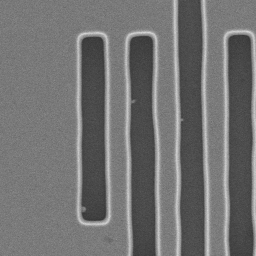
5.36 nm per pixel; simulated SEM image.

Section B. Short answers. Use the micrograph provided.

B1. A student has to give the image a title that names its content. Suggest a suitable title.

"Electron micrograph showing groups of lines, slits or small figures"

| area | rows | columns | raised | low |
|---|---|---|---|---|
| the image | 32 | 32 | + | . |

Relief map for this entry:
++++++++++++++++++++++...+++++++
++++++++++++++++++++++...+++++++
++++++++++++++++++++++...+++++++
++++++++++++++++++++++....++++++
+++++++++++..++++..+++....+++..+
++++++++++...+++...+++....++....
++++++++++...+++...+++....++....
++++++++++...+++...+++...+++....
++++++++++...+++...+++...+++....
++++++++++...+++...+++...+++....
++++++++++...+++...+++...+++....
++++++++++...+++...+++...+++....
++++++++++...+++...+++...+++....
++++++++++...+++...+++...+++....
++++++++++...+++...+++....++....
++++++++++...+++...+++....++....
++++++++++...+++....++....++....
++++++++++...+++....++....++....
++++++++++...+++....++....++....
++++++++++...+++....++....++....
++++++++++...+++....++....++....
++++++++++...+++....++....++....
++++++++++...+++....++....++....
++++++++++...+++....++....++....
++++++++++...+++....++....++....
++++++++++...+++....++....++....
++++++++++...+++....++....++....
++++++++++...+++....++....++....
++++++++++++++++....++....++....
++++++++++++++++....++....++....
++++++++++++++++....++....++....
++++++++++++++++....++....+++...